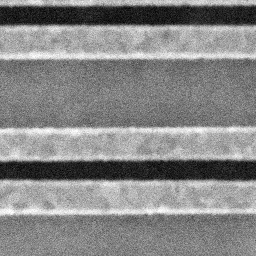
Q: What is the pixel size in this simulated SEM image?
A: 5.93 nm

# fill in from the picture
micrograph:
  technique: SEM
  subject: lines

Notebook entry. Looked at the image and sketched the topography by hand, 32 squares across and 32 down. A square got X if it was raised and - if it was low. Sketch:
XXXXXXXXXXXXXXXXXXXXXXXXXXXXXXXX
--------------------------------
--------------------------------
XXXXXXXXXXXXXXXXXXXXXXXXXXXXXXXX
XXXXXXXXXXXXXXXXXXXXXXXXXXXXXXXX
XXXXXXXXXXXXXXXXXXXXXXXXXXXXXXXX
XXXXXXXXXXXXXXXXXXXXXXXXXXXXXXXX
--------------------------------
--------------------------------
--------------------------------
--------------------------------
--------------------------------
--------------------------------
--------------------------------
--------------------------------
--------------------------------
XXXXXXXXXXXXXXXXXXXXXXXXXXXXXXXX
XXXXXXXXXXXXXXXXXXXXXXXXXXXXXXXX
XXXXXXXXXXXXXXXXXXXXXXXXXXXXXXXX
XXXXXXXXXXXXXXXXXXXXXXXXXXXXXXXX
--------------------------------
--------------------------------
--------------------------------
XXXXXXXXXXXXXXXXXXXXXXXXXXXXXXXX
XXXXXXXXXXXXXXXXXXXXXXXXXXXXXXXX
XXXXXXXXXXXXXXXXXXXXXXXXXXXXXXXX
XXXXXXXXXXXXXXXXXXXXXXXXXXXXXXXX
--------------------------------
--------------------------------
--------------------------------
--------------------------------
--------------------------------